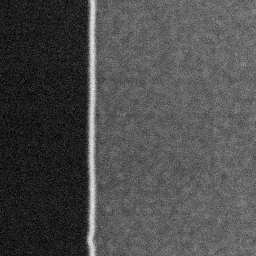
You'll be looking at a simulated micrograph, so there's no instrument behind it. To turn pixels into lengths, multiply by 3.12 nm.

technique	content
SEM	one or a few lines or trenches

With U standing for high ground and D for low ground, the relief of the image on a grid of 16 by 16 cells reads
UUUUUUDDDDDDDDDD
UUUUUUDDDDDDDDDD
UUUUUUDDDDDDDDDD
UUUUUUDDDDDDDDDD
UUUUUUDDDDDDDDDD
UUUUUUDDDDDDDDDD
UUUUUUDDDDDDDDDD
UUUUUUDDDDDDDDDD
UUUUUUDDDDDDDDDD
UUUUUUDDDDDDDDDD
UUUUUUDDDDDDDDDD
UUUUUUDDDDDDDDDD
UUUUUUDDDDDDDDDD
UUUUUUDDDDDDDDDD
UUUUUUDDDDDDDDDD
UUUUUUDDDDDDDDDD